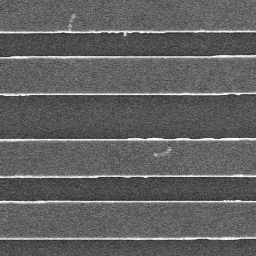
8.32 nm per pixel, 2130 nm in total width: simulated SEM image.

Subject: lines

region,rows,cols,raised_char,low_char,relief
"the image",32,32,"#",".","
################################
################################
################################
################################
................................
................................
................................
################################
################################
################################
################################
################################
................................
................................
................................
................................
................................
################################
################################
################################
################################
################################
................................
................................
................................
################################
################################
################################
################################
################################
................................
................................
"